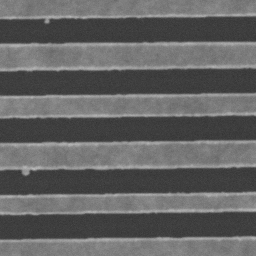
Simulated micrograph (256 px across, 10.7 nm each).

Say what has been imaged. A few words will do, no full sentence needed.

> lines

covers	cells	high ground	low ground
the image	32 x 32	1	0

11111111111111111111111111111111
11111111111111111111111111111111
00000000000000000000000000000000
00000000000000000000000000000000
00000000000000000000000000000000
00000000111111111111111111111111
11111111111111111111111111111111
11111111111111111111111111111111
11111111111111111111111111111111
00000000000000000000000000000000
00000000000000000000000000000000
00000000000000000000000000000000
11111111111111111111111111111111
11111111111111111111111111111111
11111111111111111111101010000000
00000000000000000000000000000000
00000000000000000000000000000000
00000000000000000000000000000000
11111111111111111111111111111111
11111111111111111111111111111111
11111111111111111111111111111111
00000000000000000000000000000000
00000000000000000000000000000000
00000000000000000000000000000000
11111111111111111111111111111111
11111111111111111111111111111111
11111111111111111100000000000000
00000000000000000000000000000000
00000000000000000000000000000000
00000000000000000000000000000000
11111111111111111111111111111111
11111111111111111111111111111111